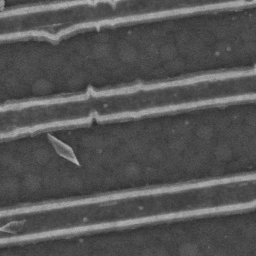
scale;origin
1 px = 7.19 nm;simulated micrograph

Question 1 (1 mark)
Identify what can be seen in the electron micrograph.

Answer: one or a few lines or trenches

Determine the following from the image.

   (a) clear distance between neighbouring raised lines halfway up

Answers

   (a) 531 nm